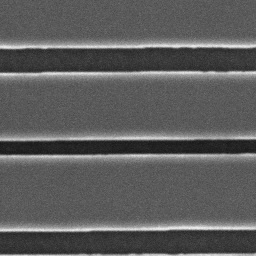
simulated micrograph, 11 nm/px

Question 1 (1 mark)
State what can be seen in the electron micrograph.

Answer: lines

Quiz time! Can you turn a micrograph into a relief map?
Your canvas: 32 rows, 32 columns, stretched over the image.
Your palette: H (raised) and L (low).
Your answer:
HHHHHHHHHHHHHHHHHHHHHHHHHHHHHHHH
HHHHHHHHHHHHHHHHHHHHHHHHHHHHHHHH
HHHHHHHHHHHHHHHHHHHHHHHHHHHHHHHH
HHHHHHHHHHHHHHHHHHHHHHHHHHHHHHHH
HHHHHHHHHHHHHHHHHHHHHHHHHHHHHHHH
HHHHHHHHHHHHHHHHHHHHHHHHHHHHHHHH
LLLLLLLLLLLLLLLLLLLLLLLLLLLLLLLL
LLLLLLLLLLLLLLLLLLLLLLLLLLLLLLLL
LLLLLLLLLLLLLLLLLLLLLLLLLLLLLLLL
HHHHHHHHHHHHHHHHHHHHHHHHHHHHHHHH
HHHHHHHHHHHHHHHHHHHHHHHHHHHHHHHH
HHHHHHHHHHHHHHHHHHHHHHHHHHHHHHHH
HHHHHHHHHHHHHHHHHHHHHHHHHHHHHHHH
HHHHHHHHHHHHHHHHHHHHHHHHHHHHHHHH
HHHHHHHHHHHHHHHHHHHHHHHHHHHHHHHH
HHHHHHHHHHHHHHHHHHHHHHHHHHHHHHHH
HHHHHHHHHHHHHHHHHHHHHHHHHHHHHHHH
HHHHHHHLLLLLLLLLLLLLLLLLLLLLLLLL
LLLLLLLLLLLLLLLLLLLLLLLLLLLLLLLL
HHHHHHHHHHHHHHHHHHHHHHHHHHHHHHHH
HHHHHHHHHHHHHHHHHHHHHHHHHHHHHHHH
HHHHHHHHHHHHHHHHHHHHHHHHHHHHHHHH
HHHHHHHHHHHHHHHHHHHHHHHHHHHHHHHH
HHHHHHHHHHHHHHHHHHHHHHHHHHHHHHHH
HHHHHHHHHHHHHHHHHHHHHHHHHHHHHHHH
HHHHHHHHHHHHHHHHHHHHHHHHHHHHHHHH
HHHHHHHHHHHHHHHHHHHHHHHHHHHHHHHH
HHHHHHHHHHHHHHHHHHHHHHHHHHHHHHHH
HHHHHHHHHHHHHHHHHHHHHHHHHHHHHHHH
LLLLLLLLLLLLLLLLLLLLLLLLLLLLLLLL
LLLLLLLLLLLLLLLLLLLLLLLLLLLLLLLL
LLLLLLLLLLLLLLLLLLLLLLLLLLLLLLLL